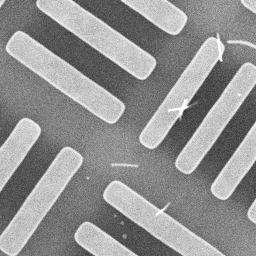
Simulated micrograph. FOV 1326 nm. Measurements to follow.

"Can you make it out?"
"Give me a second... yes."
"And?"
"groups of lines, slits or small figures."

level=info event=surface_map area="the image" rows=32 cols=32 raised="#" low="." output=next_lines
.....#####......#####.........##
.....######......######.........
.......######......####.........
........######......###.........
..##......#####.................
.####......######........###....
.#####.......#####.......###....
..######......#####.....###.....
....#####......####....####...##
.....######......#.....###...###
......######..........###....###
........######.......###....###.
.........######......###...###..
...........####.....###....###..
............###....####...###...
..###.............####...###....
..###.............###...####...#
.####.............##....###...##
####....#..............###....##
###....###............####...###
##....####............###...####
##....###..............#....###.
#....####..................###..
....####.....###..........###...
....###......#####.........##...
...####.......#####.............
..####.........#####...........#
..###...........######.........#
.####.....##......#####.........
####.....#####.....######.......
###.......#####......#####......
.#.........#####......#####.....